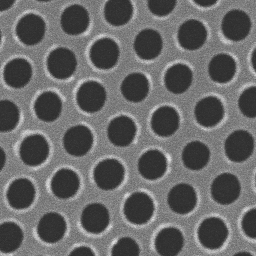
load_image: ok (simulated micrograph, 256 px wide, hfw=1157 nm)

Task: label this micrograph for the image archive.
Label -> a regular array of holes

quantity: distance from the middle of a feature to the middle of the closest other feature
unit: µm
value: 0.202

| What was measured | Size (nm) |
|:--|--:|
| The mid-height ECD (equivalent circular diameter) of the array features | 139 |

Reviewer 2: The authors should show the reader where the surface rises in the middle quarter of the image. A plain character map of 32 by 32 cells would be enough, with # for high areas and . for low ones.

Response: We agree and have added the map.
...#####.....##############....#
...#######.###############......
..##############....#####.......
.##############......####.......
#####...#######......####.......
####......####.......####.......
###.......####.......#####.....#
###........###.......######..###
###........####.....############
###.......######...#############
####......###############.######
#####....##############.....####
######################.......###
############.....#####.......###
############......####.......###
##...######.......####.......###
#......####.......####......####
.......####.......#####....#####
.......####.......##############
.......#####.....###############
.......######...##############..
.......##############...######..
#.....##############.....####...
###################......####...
#########.....#####.......####..
########.......###........####..
..#####........####.......######
...####........####......#######
....###........#####....########
....####......##################
....####......#############.....
....######.###############......